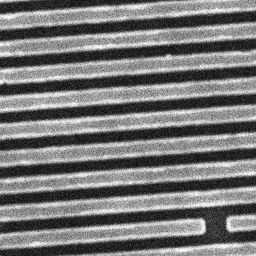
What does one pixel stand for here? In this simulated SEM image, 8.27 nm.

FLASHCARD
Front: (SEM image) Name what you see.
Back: parallel lines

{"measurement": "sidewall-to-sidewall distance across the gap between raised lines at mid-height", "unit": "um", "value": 0.117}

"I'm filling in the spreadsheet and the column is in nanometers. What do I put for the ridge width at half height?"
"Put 109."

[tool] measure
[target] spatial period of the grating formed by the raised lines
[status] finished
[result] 226 nm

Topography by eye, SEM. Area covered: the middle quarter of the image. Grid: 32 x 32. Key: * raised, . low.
********************************
***************************.....
**************..................
*...............................
................................
........................********
..........**********************
********************************
*************************.......
************....................
................................
................................
......................**********
......**************************
********************************
************************........
**********......................
................................
................................
....................************
.......*************************
********************************
**********************..........
********.*......................
................................
...............................*
................*.**************
....****************************
********************************
********************..*.........
*******.*.......................
................................